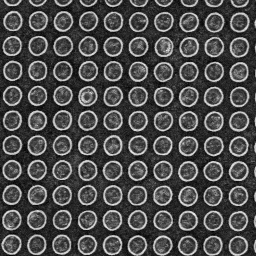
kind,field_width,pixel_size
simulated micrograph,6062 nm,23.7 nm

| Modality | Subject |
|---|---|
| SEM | a regular array of raised bodies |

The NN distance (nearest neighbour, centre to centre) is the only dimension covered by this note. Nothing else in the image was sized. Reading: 585 nm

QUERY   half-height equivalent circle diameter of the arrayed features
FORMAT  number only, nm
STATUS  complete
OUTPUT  427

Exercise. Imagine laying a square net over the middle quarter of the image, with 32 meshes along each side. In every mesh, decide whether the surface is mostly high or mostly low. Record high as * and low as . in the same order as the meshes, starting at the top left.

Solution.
**..****...***...***...****...**
**..****..****...****..****..***
**..****..****...****..****..***
*....**....***...***...***...***
................................
................................
*....***...***...***...***....**
**..****..*****.*****..****..***
**..****..****..*****..****..***
*...****..****...***...****..***
................................
................................
*...****...***...***....**....**
**..****..****..*****..****..***
**..****..****..*****..****..***
*...****..****...***...****..***
..................*.....*.....**
................................
*....**....***...***....**......
**..****..****..****...****..***
**..****..****..****...****..***
*...****..****..****...***...***
...........**.....*.....**....**
................................
*....**.....*.....*.....*.......
**..****..****...***...****..***
**..****..****..****...****..***
*...****..****..****...****..***
.....**....**....***...***...***
................................
................................
*...****..****...***...****...**